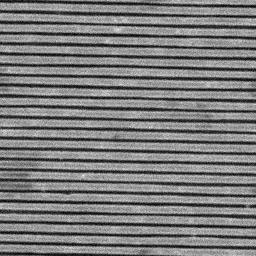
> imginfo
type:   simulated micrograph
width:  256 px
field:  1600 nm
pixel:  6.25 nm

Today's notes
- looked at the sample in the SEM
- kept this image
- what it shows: parallel lines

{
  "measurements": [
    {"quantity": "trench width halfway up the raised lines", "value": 23.4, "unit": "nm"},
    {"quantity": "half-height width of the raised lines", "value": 42.2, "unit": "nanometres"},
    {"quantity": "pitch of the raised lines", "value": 10.5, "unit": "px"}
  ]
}